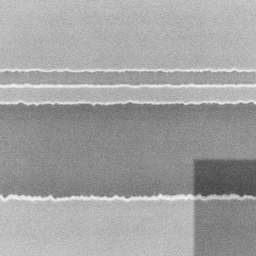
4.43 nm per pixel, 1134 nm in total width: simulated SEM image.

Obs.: lines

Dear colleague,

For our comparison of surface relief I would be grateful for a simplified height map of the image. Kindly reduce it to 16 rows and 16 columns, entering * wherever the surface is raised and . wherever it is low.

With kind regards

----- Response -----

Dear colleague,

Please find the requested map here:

****************
****************
****************
****************
****************
****************
................
................
................
................
................
................
****************
****************
****************
****************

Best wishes